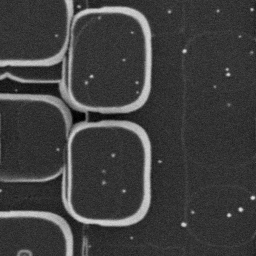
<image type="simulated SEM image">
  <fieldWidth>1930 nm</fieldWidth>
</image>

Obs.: wiring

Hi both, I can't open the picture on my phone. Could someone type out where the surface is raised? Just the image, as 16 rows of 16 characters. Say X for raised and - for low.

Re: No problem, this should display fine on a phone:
XXXX------------
XXXXXXXXX-------
XXXXXXXXX-------
XXXXXXXXX-------
----XXXXX-------
----XXXXX-------
-----XXXX-------
----------------
----XXXXX-------
----XXXXX-------
----XXXXX-------
----XXXXX-------
----XXXXX-------
XXX--XXXX-------
XXXX------------
XXXX------------